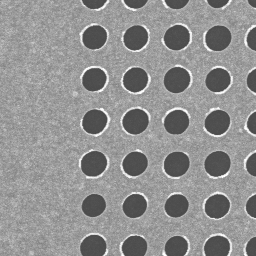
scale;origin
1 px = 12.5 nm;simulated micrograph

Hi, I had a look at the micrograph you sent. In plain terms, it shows a regular array of holes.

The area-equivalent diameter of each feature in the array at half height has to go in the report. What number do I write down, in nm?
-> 315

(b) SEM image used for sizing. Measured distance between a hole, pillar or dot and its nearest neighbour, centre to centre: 511 nm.